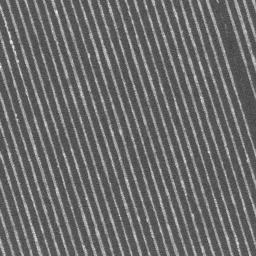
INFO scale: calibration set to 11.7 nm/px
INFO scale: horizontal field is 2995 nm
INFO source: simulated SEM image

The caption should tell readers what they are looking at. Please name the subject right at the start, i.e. parallel lines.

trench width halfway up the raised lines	81	nm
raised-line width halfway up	22.4	nm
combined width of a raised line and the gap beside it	102	nm